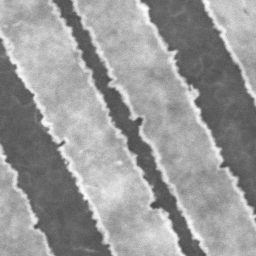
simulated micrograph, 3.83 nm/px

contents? one or a few lines or trenches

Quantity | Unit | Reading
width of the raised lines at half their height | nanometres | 225